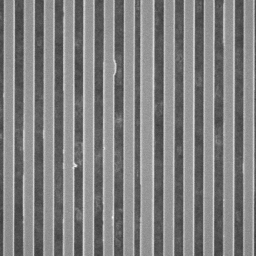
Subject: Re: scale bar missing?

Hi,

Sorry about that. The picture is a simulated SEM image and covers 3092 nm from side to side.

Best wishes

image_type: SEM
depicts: parallel lines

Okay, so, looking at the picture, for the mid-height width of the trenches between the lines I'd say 125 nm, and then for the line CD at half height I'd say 116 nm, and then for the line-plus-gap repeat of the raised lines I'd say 0.241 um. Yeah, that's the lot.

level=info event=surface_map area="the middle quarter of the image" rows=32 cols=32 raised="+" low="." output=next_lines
++...++...+++..++..+++...++...++
++...++...+++..++..+++...++...++
++...++...++...++..+++...++...++
++...++...++...++..+++...++...++
++...++...++...++..+++...++...++
++...++...++...++..+++...++...++
++...++...++...++..+++...++...++
++...++...++...++..+++...++...++
++...++...++...++..+++...++...++
++...++...++...++..+++...++...++
++...++...++...++..+++...++...++
++...++...++...++..+++...++...++
++...++...++...++..+++...++...++
++...++...++...++..+++...++...++
++...++...++...++..+++...++...++
++...++...++...++..+++...++...++
++...++...++...++..+++...++...++
++...++...++...++..+++...++...++
++...++...++...++..+++...++...++
++...++...++...++..+++...++...++
++...++...++...++..+++...++...++
++...++...++...++..+++...++...++
++...++...++...++..+++...++...++
++...++...++...++..+++...++...++
++...++...++...++..+++...++...++
+++..++...++...++..+++...++...++
++...++...++...++..+++...++...++
++...++...++...++..+++...++...++
++...++...++...++..+++...++...++
++...++...++...++..+++...++...++
++...++...++...++..+++...++...++
++...++...++...++..+++...++...++